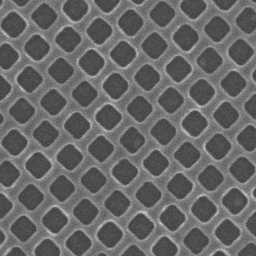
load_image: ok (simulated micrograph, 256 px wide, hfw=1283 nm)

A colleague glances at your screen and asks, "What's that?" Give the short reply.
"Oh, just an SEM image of a regular array of holes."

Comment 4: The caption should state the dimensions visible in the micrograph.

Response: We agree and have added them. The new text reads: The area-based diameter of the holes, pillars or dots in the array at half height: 123 nanometers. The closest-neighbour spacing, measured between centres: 161 nanometres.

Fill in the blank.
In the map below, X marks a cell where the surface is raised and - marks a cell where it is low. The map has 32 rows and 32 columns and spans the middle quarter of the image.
--XX------XXXX--XXXX--XXX-------
---XX----XXXXXXXXXX----XX-------
--XXXX--XXXX--XXXX------XX-----X
-XXXXXXXXXX----XX-------XXX---XX
XXXX--XXXX------XX------XXXX-XXX
XXX----XXX------XXX----XXXXXXXXX
XX------XX------XXXX--XXX---XXX-
XX-------XX----XXXXXXXXXX----XX-
XX------XXXX--XXXX--XXXX------XX
-XX----XXXXXXXXXX----XX-------XX
XXXX--XXXX--XXXX------XX-----XXX
XXXXXXXXX----XXX------XXX---XXXX
XX--XXXX------XX------XXXXXXXXX-
X----XXX------XXX----XXXXXXXXX--
------XX------XXXX--XXX---XXX---
-------XX----XXXXXXXXX-----XX---
------XXXX--XXX---XXXX------XX--
X----XXXXXXXXXX----XXX------XXX-
XXX-XXXX--XXXX------XXX----XXXXX
XXXXXXX----XXX------XXX---XXXX-X
--XXXX------XXX-----XXXXXXXXX---
---XXX-------XXX---XXX-XXXXX----
----XXX-----XXXXXXXXX----XXX----
-----XXX---XXXXXXXXX------XX----
----XXXXX-XXXX---XXX------XXX---
---XXXXXXXXXX-----XX------XXX---
X-XXXX---XXX------XXX----XXXXXXX
XXXXX-----XX------XXXX--XXXX--XX
-XXX-------XX-----XXXXXXXXX----X
--XX-------XXX---XXX--XXXX------
---XX-----XXXXXXXXX----XXX------
---XXX---XXXX-XXXX------XX------